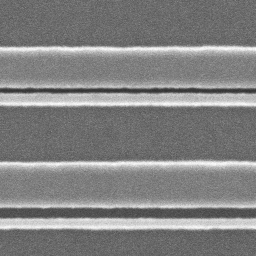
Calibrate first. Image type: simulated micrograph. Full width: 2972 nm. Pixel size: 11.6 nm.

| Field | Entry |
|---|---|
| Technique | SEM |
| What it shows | lines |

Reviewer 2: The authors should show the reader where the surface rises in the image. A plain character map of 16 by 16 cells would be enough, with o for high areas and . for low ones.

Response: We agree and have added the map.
................
................
................
oooooooooooooooo
oooooooooooooooo
oooooooooooooooo
................
................
................
................
oooooooooooooooo
oooooooooooooooo
oooooooooooooooo
oooooooooooooooo
................
................